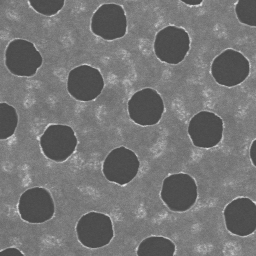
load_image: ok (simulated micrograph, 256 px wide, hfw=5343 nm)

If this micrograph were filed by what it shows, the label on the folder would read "a regular array of holes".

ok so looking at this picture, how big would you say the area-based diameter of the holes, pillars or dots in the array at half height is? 756 nm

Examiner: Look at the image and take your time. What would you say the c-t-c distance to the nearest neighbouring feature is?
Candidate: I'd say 63.6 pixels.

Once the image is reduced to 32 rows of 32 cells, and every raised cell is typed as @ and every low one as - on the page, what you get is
@@@@----@@@@@@@@@@@@@@@--@@@@@--
@@@@@--@@@@@----@@@@@@@@@@@@@---
@@@@@@@@@@@-----@@@@@@@@@@@@@@--
@@@@@@@@@@@-----@@@@@-@@@@@@@@@@
@@@@@@@@@@@@---@@@@@----@@@@@@@@
@---@@@@@@@@@@@@@@@-----@@@@@@@@
@----@@@@@@@@@@@@@@----@@@@@--@@
@----@@@@@@@@@@@@@@@---@@@@----@
@----@@@@@--@@@@@@@@@@@@@@-----@
@@@@@@@@@----@@@@@@@@@@@@@@----@
@@@@@@@@-----@@@@@@@@@@@@@@@--@@
@@@@@@@@@----@@@@--@@@@@@@@@@@@@
@@@@@@@@@@-@@@@@----@@@@@@@@@@@@
--@@@@@@@@@@@@@@----@@@@@@@@@@@@
--@@@@@@@@@@@@@@----@@@@---@@@@@
--@@@@@@@@@@@@@@@--@@@@@----@@@@
--@@@@---@@@@@@@@@@@@@@@----@@@@
@@@@@-----@@@@@@@@@@@@@@----@@@@
@@@@@----@@@@@@-@@@@@@@@@@@@@@@-
@@@@@@---@@@@----@@@@@@@@@@@@@@-
@@@@@@@@@@@@@----@@@@@@@@@@@@@@@
@@@@@@@@@@@@@----@@@@@@@@@@@@@@@
@@@@@@@@@@@@@@--@@@@@---@@@@@@@@
@@@@-@@@@@@@@@@@@@@@-----@@@@@@@
@@@---@@@@@@@@@@@@@@-----@@@@@@@
@@-----@@@@@@@@@@@@@@---@@@@@---
@@-----@@@@@@@@@@@@@@@@@@@@@----
@@@---@@@@----@@@@@@@@@@@@@@----
@@@@@@@@@@----@@@@@@@@@@@@@@----
@@@@@@@@@@----@@@@@@@@@@@@@@@@@@
@@@@@@@@@@---@@@@@----@@@@@@@@@@
---@@@@@@@@@@@@@@-----@@@@@@@@@@